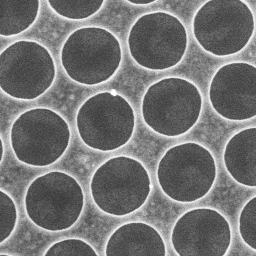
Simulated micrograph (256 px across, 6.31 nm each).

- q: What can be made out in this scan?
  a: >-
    a regular array of holes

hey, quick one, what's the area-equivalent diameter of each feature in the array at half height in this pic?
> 368 nm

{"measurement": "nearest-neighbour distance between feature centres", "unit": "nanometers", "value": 419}